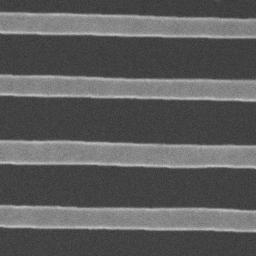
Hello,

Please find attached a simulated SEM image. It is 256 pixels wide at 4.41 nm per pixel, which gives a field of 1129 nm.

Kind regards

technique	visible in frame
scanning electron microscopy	lines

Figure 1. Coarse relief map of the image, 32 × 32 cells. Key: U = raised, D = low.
DDDDDDDDDDDDDDDDDDDDDDDDDDDDDDDD
DDDDDDDDDDDDDDDDDDDDDDDDDDDDDDDD
UUUUUUUUUUUUUUUUUUUUUUUUUUUUUUUU
UUUUUUUUUUUUUUUUUUUUUUUUUUUUUUUU
DDDDDDDDDDDDDDDDDDDDUUUUUUUUUUUU
DDDDDDDDDDDDDDDDDDDDDDDDDDDDDDDD
DDDDDDDDDDDDDDDDDDDDDDDDDDDDDDDD
DDDDDDDDDDDDDDDDDDDDDDDDDDDDDDDD
DDDDDDDDDDDDDDDDDDDDDDDDDDDDDDDD
UUDDDDDDDDDDDDDDDDDDDDDDDDDDDDDD
UUUUUUUUUUUUUUUUUUUUUUUUUUUUUUUU
UUUUUUUUUUUUUUUUUUUUUUUUUUUUUUUU
DDDDDDDDDDDDDDDDDDDDDDDDDDDDDDUU
DDDDDDDDDDDDDDDDDDDDDDDDDDDDDDDD
DDDDDDDDDDDDDDDDDDDDDDDDDDDDDDDD
DDDDDDDDDDDDDDDDDDDDDDDDDDDDDDDD
DDDDDDDDDDDDDDDDDDDDDDDDDDDDDDDD
DDDDDDDDDDDDDDDDDDDDDDDDDDDDDDDD
UUUUUUUUUUUUUUUUUUUUUUUUUUUUUUUU
UUUUUUUUUUUUUUUUUUUUUUUUUUUUUUUU
DDDDDDDDDDDDUUUUUUUUUUUUUUUUUUUU
DDDDDDDDDDDDDDDDDDDDDDDDDDDDDDDD
DDDDDDDDDDDDDDDDDDDDDDDDDDDDDDDD
DDDDDDDDDDDDDDDDDDDDDDDDDDDDDDDD
DDDDDDDDDDDDDDDDDDDDDDDDDDDDDDDD
DDDDDDDDDDDDDDDDDDDDDDDDDDDDDDDD
UUUUUUUUUUUUUUUUUUUUUUUUUUUUUUUU
UUUUUUUUUUUUUUUUUUUUUUUUUUUUUUUU
DDDDDDDDDDDUUUUUUUUUUUUUUUUUUUUU
DDDDDDDDDDDDDDDDDDDDDDDDDDDDDDDD
DDDDDDDDDDDDDDDDDDDDDDDDDDDDDDDD
DDDDDDDDDDDDDDDDDDDDDDDDDDDDDDDD